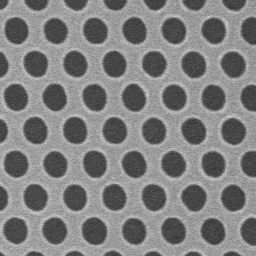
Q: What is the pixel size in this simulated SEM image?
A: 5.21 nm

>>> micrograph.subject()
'a regular array of holes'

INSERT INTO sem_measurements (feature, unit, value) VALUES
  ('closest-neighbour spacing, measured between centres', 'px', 38.5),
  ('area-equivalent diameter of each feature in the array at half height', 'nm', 137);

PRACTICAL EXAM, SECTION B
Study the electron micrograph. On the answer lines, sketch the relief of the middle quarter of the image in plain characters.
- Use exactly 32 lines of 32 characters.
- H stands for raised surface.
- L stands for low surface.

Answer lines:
LLLLLLHHHHLLLLLLHHHLLLLLLLHHHLLL
LLLLLLHHHHLLLLLHHHHHLLLLLHHHHLLL
HLLLLHHHHHLLLLLHHHHHHLLLLHHHHHLL
HHHHHHHHHHHHHHHHHHHHHHHHHHHHHHHL
HHHHHHHHHHHHHHHHHHHHHHHHHHHHHHHH
HHHHHHLLLHHHHHHHLLLHHHHHHHLLLHHH
HHHHHLLLLLHHHHHLLLLLHHHHHLLLLLHH
HHHHLLLLLLLHHHLLLLLLHHHHHLLLLLLH
LHHHLLLLLLLHHHLLLLLLHHHHLLLLLLLH
LHHHHLLLLLLHHHLLLLLLHHHHHLLLLLLH
HHHHHLLLLLHHHHHLLLLLHHHHHLLLLLHH
HHHHHHLLLLHHHHHHLLLHHHHHHHLLLHHH
HHHHHHHHHHHHHHHHHHHHHHHHHHHHHHHH
HLLLHHHHHHHLLLHHHHHHHLLHHHHHHHHH
LLLLLHHHHHLLLLLHHHHHLLLLLHHHHHLL
LLLLLHHHHHLLLLLLHHHLLLLLLHHHHLLL
LLLLLLHHHHLLLLLLHHHLLLLLLLHHHLLL
LLLLLLHHHHLLLLLLHHHLLLLLLLHHHLLL
LLLLLHHHHHLLLLLLHHHHLLLLLHHHHHLL
HLLLLHHHHHHLLLLHHHHHHLLLLHHHHHHL
HHHHHHHHHHHHHHHHHHHHHHHHHHHHHHHH
HHHHHHHHHHHHHHHHHHHHHHHHHHHHHHHH
HHHHHLLLLLHHHHHLLLLHHHHHHLLLLHHH
HHHHHLLLLLHHHHLLLLLLHHHHLLLLLLHH
LHHHHLLLLLLHHHLLLLLLLHHHLLLLLLHH
LHHHHLLLLLLHHHLLLLLLLHHHLLLLLLLH
LHHHHLLLLLLHHHHLLLLLLHHHLLLLLLHH
HHHHHHLLLLHHHHHLLLLLHHHHHLLLLLHH
HHHHHHHLHHHHHHHHHLLHHHHHHHHLLHHH
HHHHHHHHHHHHHHHHHHHHHHHHHHHHHHHH
HLLLHHHHHHHLLLHHHHHHLLLLHHHHHHHL
LLLLLHHHHHLLLLLHHHHHLLLLLHHHHHLL